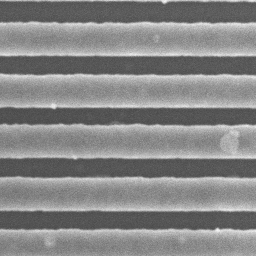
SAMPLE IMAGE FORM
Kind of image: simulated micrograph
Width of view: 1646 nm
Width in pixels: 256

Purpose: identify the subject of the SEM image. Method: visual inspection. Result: lines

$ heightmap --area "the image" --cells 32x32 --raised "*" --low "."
................................
................................
................................
********************************
********************************
********************************
********************************
................................
................................
********************************
********************************
********************************
********************************
......*.........................
................................
................................
********************************
********************************
********************************
********************************
................................
................................
********************************
********************************
********************************
********************************
................................
................................
................................
********************************
********************************
********************************